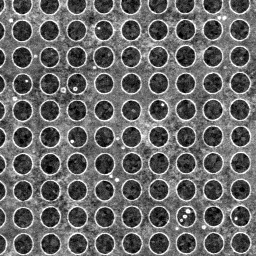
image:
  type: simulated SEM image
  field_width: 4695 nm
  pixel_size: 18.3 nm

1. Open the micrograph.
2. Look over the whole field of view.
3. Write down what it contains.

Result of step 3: a regular array of raised bodies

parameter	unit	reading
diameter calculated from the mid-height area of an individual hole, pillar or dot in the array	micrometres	0.374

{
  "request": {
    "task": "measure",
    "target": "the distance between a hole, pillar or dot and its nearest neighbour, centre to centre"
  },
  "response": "0.486 µm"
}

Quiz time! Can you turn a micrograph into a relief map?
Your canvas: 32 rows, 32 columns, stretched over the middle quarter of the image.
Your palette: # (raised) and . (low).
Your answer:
..##....####....##....###....##.
................................
...#............##.....##.....#.
.####...####...####...####..####
.#####..####..#####..#####..####
.#####..####...####..#####..####
.####...####...####...####...###
................................
................................
..###....##.....##....###....###
.####...####...####..#####..####
.#####..####...####..#####..####
.#####..####...####...####..####
..###...####...####...###....###
................................
................................
..###...####...####...####...###
.#####..####...####..#####..####
.#####..####...####..#####..####
.#####..####...####...####..####
..###....##.....##.....##....###
................................
..##............##.....##.....##
.####...####...####...####..####
.#####..####...####..#####..####
.#####..#####..####..#####..####
.####...####...####...####...###
...#.....##.....................
................................
..###....##....###....###....###
.#####..####...####..#####..####
.#####..#####..####..#####..####